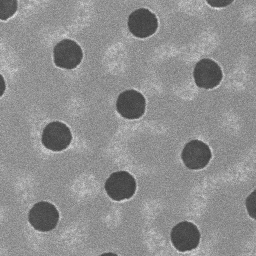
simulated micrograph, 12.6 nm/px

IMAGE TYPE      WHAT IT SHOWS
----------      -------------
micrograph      a regular array of holes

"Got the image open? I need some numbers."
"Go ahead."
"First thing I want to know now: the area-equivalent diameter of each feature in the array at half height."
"30.7 px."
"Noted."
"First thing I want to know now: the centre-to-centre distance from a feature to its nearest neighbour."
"1020 nm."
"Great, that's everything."